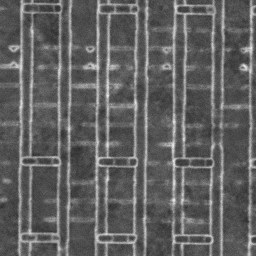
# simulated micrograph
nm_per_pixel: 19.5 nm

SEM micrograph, wiring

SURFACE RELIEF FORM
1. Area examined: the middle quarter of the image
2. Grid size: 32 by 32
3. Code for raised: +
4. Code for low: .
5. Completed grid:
++......+++.......+++......+++..
++......+++.......+++......+++..
++......+++.......+++......+++..
++......+++.......+++......+++..
++......+++.......+++......+++..
++......+++.......+++......+++..
++......+++.......+++......+++..
++......+++.......+++......+++..
++......+++.......+++......+++..
++......+++.......+++......+++..
+.......+++.......+++......+++..
+.......+++.......++.......+++..
+.......+++.......+++......+++..
+.......+++.......+++......+++..
+.......+++.......+++......+++..
+.......+++.......+++......+++..
+.......+++.......+++......+++..
+.......+++.......+++......+++..
+.......+++.......+++......+++..
+.......+++.......+++......+++..
+.......+++.......+++......+++..
+.......+++.......+++......+++..
+.......+++.......+++......+++..
+.......+++++++++++++......++++.
+.......++++++++++++.......+++++
+.......++++++++++++.......+++++
+.......+++.......++.......+++..
+.......+++.......++.......+++..
+.......+++.......++.......+++..
+.......+++.......++.......+++..
+.......+++.......++.......+++..
+.......+++.......++.......+++..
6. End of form